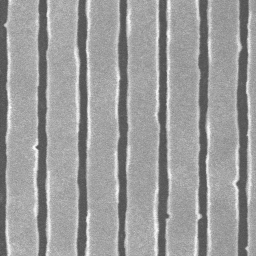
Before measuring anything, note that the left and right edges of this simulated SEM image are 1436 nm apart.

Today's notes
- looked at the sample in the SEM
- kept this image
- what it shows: parallel lines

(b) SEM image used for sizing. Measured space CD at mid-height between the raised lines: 9.25 px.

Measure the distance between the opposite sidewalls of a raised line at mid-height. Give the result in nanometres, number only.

170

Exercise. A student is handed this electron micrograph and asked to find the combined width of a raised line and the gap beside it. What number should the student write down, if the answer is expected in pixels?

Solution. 40.1